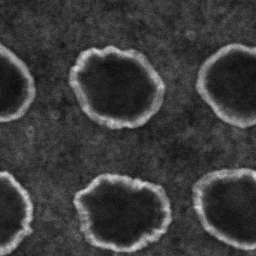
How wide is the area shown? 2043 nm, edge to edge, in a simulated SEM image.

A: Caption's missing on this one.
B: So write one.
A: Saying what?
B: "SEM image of raised bodies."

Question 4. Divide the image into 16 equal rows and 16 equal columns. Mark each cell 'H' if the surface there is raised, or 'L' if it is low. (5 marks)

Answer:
LLLLLLLLLLLLLLLL
LLLLLLLLLLLLLLLL
LLLLLLLLLLLLLLLL
HLLLLHHHHLLLLLHH
HHLLLHHHHLLLLHHH
HHLLLHHHHHLLLHHH
HHLLLHHHHHLLLHHH
LLLLLLHHHLLLLLHH
LLLLLLLLLLLLLLLL
LLLLLLLLLLLLLLLL
LLLLLLLLLLLLLLLL
HLLLLLHHHLLLLHHH
HHLLLHHHHHLLHHHH
HHLLLHHHHHLLLHHH
HLLLLHHHHHLLLHHH
HLLLLLLHLLLLLLLL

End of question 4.